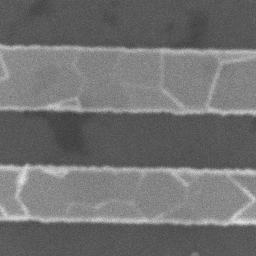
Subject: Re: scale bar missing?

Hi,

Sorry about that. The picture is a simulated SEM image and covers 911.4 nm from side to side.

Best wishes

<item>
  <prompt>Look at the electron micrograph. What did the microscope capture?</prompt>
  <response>lines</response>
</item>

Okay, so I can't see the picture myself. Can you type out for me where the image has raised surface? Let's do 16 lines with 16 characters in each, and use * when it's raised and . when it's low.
................
................
................
****************
****************
****************
****************
................
................
................
*******.........
****************
****************
****************
................
................